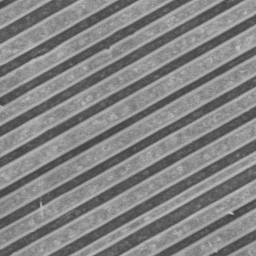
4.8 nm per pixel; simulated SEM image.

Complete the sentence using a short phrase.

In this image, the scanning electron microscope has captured parallel lines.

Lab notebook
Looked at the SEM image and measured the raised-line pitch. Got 129 nm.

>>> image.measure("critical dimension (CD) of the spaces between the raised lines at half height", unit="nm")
57.5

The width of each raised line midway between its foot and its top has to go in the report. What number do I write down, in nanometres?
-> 70.7